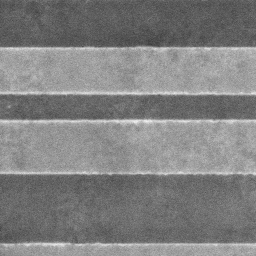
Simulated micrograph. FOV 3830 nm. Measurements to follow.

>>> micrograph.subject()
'lines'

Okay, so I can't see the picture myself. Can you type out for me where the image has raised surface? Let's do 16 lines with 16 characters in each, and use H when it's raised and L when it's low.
LLLLLLLLLLLLLLLL
LLLLLLLLLLLLLLLL
LLLLLLLLLLLLLLLL
HHHHHHHHHHHHHHHH
HHHHHHHHHHHHHHHH
HHHHHHHHHHHHHHHH
HHHHHHHHHHHHHHHH
HHHHHHHHHHHHHHHH
HHHHHHHHHHHHHHHH
HHHHHHHHHHHHHHHH
HHHHHHHHHHHHHHHH
LLLLLLLLLLLLLLLL
LLLLLLLLLLLLLLLL
LLLLLLLLLLLLLLLL
LLLLLLLLLLLLLLLL
HHHHHHHHHHHHHHHH